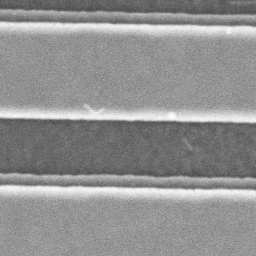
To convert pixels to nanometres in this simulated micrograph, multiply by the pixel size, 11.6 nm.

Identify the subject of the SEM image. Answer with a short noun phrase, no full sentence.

lines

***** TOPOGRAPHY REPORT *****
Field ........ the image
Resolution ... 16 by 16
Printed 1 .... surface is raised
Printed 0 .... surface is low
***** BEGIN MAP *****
0000000000000000
1111111000000000
1111111111111111
1111111111111111
1111111111111111
1111111111111111
1111111111111111
0000000011111111
0000000000000000
0000000000000000
0000000000000000
0000000000000000
1111111111111111
1111111111111111
1111111111111111
1111111111111111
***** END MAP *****